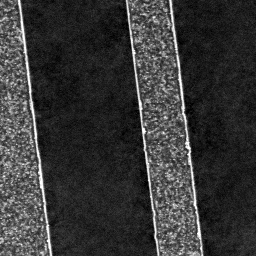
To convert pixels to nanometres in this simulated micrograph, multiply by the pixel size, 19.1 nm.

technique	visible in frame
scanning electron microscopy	one or a few lines or trenches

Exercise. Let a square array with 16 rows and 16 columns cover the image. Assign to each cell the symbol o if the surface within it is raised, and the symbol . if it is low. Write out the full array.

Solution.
o.......ooo.....
o.......ooo.....
oo......ooo.....
oo......ooo.....
oo......ooo.....
oo.......oo.....
oo.......oo.....
oo.......ooo....
oo.......ooo....
oo.......ooo....
ooo......ooo....
ooo......ooo....
ooo......ooo....
ooo.......oo....
ooo.......oo....
ooo.......ooo...